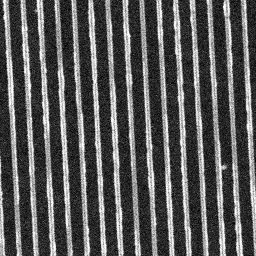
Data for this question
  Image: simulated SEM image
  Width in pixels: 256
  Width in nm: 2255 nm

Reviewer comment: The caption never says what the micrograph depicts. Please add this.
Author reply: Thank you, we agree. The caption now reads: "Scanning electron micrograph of parallel lines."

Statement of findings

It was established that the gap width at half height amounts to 107 nanometers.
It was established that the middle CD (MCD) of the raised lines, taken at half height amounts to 45.1 nm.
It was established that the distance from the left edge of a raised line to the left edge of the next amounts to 149 nm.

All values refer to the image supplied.